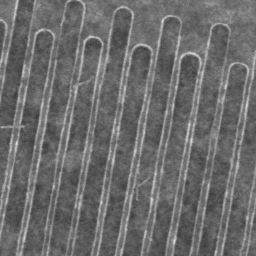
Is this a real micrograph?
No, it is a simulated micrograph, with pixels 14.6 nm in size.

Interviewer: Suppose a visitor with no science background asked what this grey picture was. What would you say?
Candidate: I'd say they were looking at parallel lines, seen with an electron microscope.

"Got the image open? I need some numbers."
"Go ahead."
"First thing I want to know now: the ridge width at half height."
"86.2 nm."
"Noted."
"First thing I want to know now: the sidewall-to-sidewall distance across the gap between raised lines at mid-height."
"0.275 µm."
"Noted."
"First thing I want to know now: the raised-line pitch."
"358 nm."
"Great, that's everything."